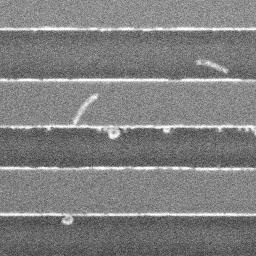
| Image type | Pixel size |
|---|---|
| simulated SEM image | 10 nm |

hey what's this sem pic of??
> lines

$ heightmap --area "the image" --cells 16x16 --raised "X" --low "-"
XXXXXXXXXXXXXXXX
XXXXXXXXXXXXXXXX
----------------
----------------
----------------
XXXXXXXXXXXXXXXX
XXXXXXXXXXXXXXXX
XXXXXXXXXXXXXXXX
----------------
----------------
XXXX-XXXXXXX----
XXXXXXXXXXXXXXXX
XXXXXXXXXXXXXXXX
----------------
----------------
----------------